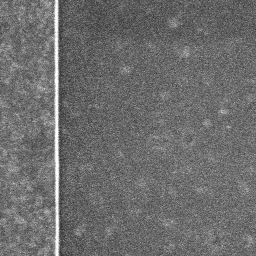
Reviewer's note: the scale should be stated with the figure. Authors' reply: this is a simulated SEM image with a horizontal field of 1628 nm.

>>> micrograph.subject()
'one or a few lines or trenches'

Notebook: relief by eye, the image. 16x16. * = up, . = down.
***.............
****............
****............
****............
****............
****............
****............
****............
****............
****............
****............
****............
****............
****............
****............
****............